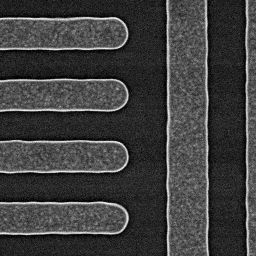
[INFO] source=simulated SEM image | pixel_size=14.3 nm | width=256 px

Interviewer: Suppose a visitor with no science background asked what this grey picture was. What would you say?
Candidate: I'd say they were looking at groups of lines, slits or small figures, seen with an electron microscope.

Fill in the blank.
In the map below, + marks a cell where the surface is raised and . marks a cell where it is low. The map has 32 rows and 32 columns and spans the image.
.....................+++++.....+
.....................+++++.....+
+++++++++++++++......+++++.....+
++++++++++++++++.....+++++.....+
++++++++++++++++.....+++++.....+
+++++++++++++++......+++++.....+
.....................+++++.....+
.....................+++++.....+
.....................+++++.....+
.....................+++++.....+
+++++++++++++++......+++++.....+
++++++++++++++++.....+++++.....+
++++++++++++++++.....+++++.....+
+++++++++++++++......+++++.....+
.....................+++++.....+
.....................+++++.....+
.....................+++++.....+
.....................+++++.....+
++++++++++++++++.....+++++.....+
++++++++++++++++.....+++++.....+
++++++++++++++++.....+++++.....+
.....................+++++.....+
.....................+++++.....+
.....................+++++.....+
.....................+++++.....+
++++++++++++++.......+++++.....+
++++++++++++++++.....+++++.....+
++++++++++++++++.....+++++.....+
++++++++++++++++.....+++++.....+
.....................+++++.....+
.....................+++++.....+
.....................+++++.....+